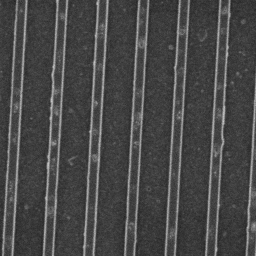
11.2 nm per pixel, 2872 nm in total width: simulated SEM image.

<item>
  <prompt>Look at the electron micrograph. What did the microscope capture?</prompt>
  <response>parallel lines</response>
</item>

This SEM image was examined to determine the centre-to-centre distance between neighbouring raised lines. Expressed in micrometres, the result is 0.455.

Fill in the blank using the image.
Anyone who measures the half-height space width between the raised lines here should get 30.8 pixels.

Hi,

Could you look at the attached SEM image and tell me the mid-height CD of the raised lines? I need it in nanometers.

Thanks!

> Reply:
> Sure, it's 108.